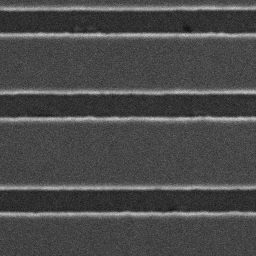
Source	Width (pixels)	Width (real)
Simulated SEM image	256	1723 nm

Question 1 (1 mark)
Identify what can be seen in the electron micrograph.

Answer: lines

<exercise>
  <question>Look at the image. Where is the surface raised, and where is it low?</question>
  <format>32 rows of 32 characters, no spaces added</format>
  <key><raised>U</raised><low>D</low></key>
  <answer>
UUUUUUUUUUUUUUUUUUUUUUUUUUUUUUUU
DDDDDDDDDDDDDDDDDDDDDDDDDDDDDDDD
DDDDDDDDDDDDDDDDDDDDDDDDDDDDDDDD
DDDDDDDDDDDDDDDDDDDDDDDDDDDDDDDD
UUUUUUUUUUUUUUUUUUUUUUUUUUUUUUUU
UUUUUUUUUUUUUUUUUUUUUUUUUUUUUUUU
UUUUUUUUUUUUUUUUUUUUUUUUUUUUUUUU
UUUUUUUUUUUUUUUUUUUUUUUUUUUUUUUU
UUUUUUUUUUUUUUUUUUUUUUUUUUUUUUUU
UUUUUUUUUUUUUUUUUUUUUUUUUUUUUUUU
UUUUUUUUUUUUUUUUUUUUUUUUUUUUUUUU
UUUUUUUUUUUUUUUUUUUUUUUUUUUUUUUU
DDDDDDDDDDDDDDDDDDDDDDDDDDDDDDDD
DDDDDDDDDDDDDDDDDDDDDDDDDDDDDDDD
DDDDDDDDDDDDDDDDDDDDDDDDDDDDDDDD
UUUUUUUUUUUUUUUUUUUUUUUUUUUUUUUU
UUUUUUUUUUUUUUUUUUUUUUUUUUUUUUUU
UUUUUUUUUUUUUUUUUUUUUUUUUUUUUUUU
UUUUUUUUUUUUUUUUUUUUUUUUUUUUUUUU
UUUUUUUUUUUUUUUUUUUUUUUUUUUUUUUU
UUUUUUUUUUUUUUUUUUUUUUUUUUUUUUUU
UUUUUUUUUUUUUUUUUUUUUUUUUUUUUUUU
UUUUUUUUUUUUUUUUUUUUUUUUUUUUUUUU
UUUUUUUUUUUUUUUUUUUUUUUUUUUUUUUU
DDDDDDDDDDDDDDDDDDDDDDDDDDDDDDDD
DDDDDDDDDDDDDDDDDDDDDDDDDDDDDDDD
DDDDDDDDDDDDDDDDDDDDDDDDDDDDDDDD
UUUUUUUUUUUUUUUUUUUUUUUUUUUUUUUU
UUUUUUUUUUUUUUUUUUUUUUUUUUUUUUUU
UUUUUUUUUUUUUUUUUUUUUUUUUUUUUUUU
UUUUUUUUUUUUUUUUUUUUUUUUUUUUUUUU
UUUUUUUUUUUUUUUUUUUUUUUUUUUUUUUU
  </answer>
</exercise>